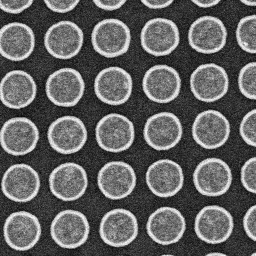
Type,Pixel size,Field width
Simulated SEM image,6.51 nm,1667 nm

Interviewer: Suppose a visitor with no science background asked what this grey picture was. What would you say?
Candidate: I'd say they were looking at a regular array of raised bodies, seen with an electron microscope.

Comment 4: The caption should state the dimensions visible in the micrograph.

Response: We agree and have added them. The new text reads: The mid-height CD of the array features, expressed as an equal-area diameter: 0.233 microns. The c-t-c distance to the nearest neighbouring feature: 307 nanometers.